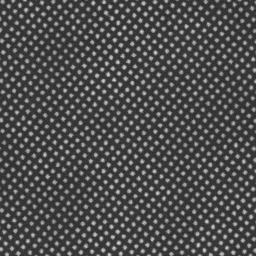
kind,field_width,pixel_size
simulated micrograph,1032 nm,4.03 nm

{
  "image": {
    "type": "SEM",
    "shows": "a regular array of raised bodies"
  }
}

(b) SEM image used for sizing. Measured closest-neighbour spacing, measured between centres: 30.1 nanometres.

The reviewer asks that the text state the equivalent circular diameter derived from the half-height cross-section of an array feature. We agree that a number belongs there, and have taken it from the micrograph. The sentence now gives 15.8 nanometers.